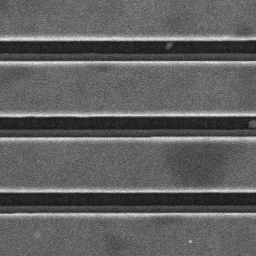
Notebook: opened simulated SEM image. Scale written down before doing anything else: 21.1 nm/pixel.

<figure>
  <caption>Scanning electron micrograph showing lines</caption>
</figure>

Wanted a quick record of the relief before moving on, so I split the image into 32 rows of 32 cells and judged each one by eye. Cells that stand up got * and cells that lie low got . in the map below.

********************************
********************************
********************************
********************************
********************************
................................
................................
................................
********************************
********************************
********************************
********************************
********************************
********************************
*******..***....................
................................
................................
********************************
********************************
********************************
********************************
********************************
********************************
********************************
................................
................................
................................
********************************
********************************
********************************
********************************
********************************